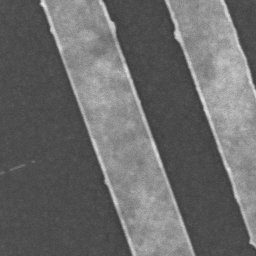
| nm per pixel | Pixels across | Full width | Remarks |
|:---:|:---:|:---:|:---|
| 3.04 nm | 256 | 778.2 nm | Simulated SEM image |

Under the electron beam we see one or a few lines or trenches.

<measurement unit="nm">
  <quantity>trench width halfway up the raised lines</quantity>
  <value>181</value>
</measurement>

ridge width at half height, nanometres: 172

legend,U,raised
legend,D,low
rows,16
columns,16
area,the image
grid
DDDUUUUDDDDUUUDD
DDDUUUUDDDDUUUUD
DDDUUUUDDDDUUUUD
DDDDUUUUDDDDUUUD
DDDDUUUUDDDDUUUU
DDDDDUUUDDDDUUUU
DDDDDUUUUDDDDUUU
DDDDDUUUUDDDDUUU
DDDDDDUUUDDDDUUU
DDDDDDUUUUDDDDUU
DDDDDDUUUUDDDDUU
DDDDDDDUUUDDDDDU
DDDDDDDUUUUDDDDU
DDDDDDDUUUUDDDDU
DDDDDDDDUUUUDDDD
DDDDDDDDUUUUDDDD